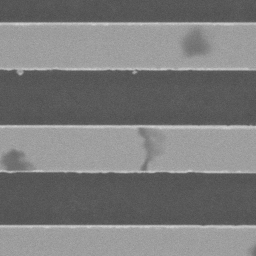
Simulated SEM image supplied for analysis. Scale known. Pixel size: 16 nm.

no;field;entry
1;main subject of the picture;lines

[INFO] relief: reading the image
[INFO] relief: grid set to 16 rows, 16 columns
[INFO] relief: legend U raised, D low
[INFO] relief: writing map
DDDDDDDDDDDDDDDD
UUUUUUUUUUUUUUUU
UUUUUUUUUUUUUUUU
UUUUUUUUUUUUUUUU
DDDDDDDDDDDDDDDD
DDDDDDDDDDDDDDDD
DDDDDDDDDDDDDDDD
DDDDDDDDDDDDDDDD
UUUUUUUUUUUUUUUU
UUUUUUUUUUUUUUUU
UUUUUUUUUUUUUUUU
DDDDDDDDDDDDDDDD
DDDDDDDDDDDDDDDD
DDDDDDDDDDDDDDDD
UUUUUUUUUUUUUUUU
UUUUUUUUUUUUUUUU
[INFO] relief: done